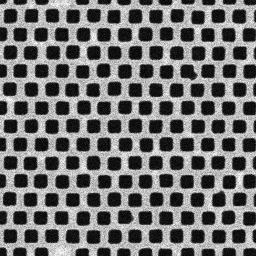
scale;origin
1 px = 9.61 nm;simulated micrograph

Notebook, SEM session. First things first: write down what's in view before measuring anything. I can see a regular array of holes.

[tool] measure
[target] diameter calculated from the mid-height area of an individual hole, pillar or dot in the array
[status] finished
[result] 147 nm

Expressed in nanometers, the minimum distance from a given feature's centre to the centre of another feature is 196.